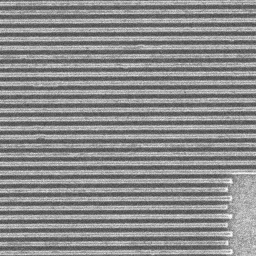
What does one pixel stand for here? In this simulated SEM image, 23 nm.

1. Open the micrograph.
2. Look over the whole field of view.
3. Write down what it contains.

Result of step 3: parallel lines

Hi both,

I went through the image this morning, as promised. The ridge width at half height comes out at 80.4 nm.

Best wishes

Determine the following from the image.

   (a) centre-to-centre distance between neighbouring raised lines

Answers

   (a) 204 nm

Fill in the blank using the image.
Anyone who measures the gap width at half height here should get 121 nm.